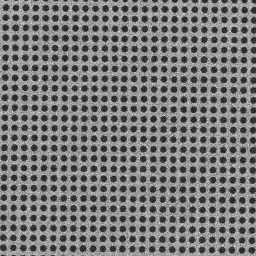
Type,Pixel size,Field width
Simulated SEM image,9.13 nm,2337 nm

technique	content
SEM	a regular array of holes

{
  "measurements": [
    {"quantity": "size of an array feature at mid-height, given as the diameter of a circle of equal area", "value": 0.0592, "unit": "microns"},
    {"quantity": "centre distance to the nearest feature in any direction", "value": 89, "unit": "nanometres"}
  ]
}